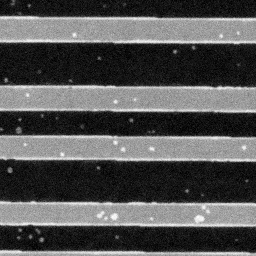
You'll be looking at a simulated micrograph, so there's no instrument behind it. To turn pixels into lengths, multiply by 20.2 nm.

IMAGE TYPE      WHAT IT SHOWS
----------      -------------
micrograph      lines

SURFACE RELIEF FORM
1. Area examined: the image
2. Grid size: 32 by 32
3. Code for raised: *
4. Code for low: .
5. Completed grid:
................................
................................
********************************
********************************
********************************
................................
................................
................................
................................
................................
................................
********************************
********************************
********************************
................................
................................
................................
********************************
********************************
********************************
................................
................................
................................
................................
................................
********************************
********************************
********************************
................................
................................
................................
*...............................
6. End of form